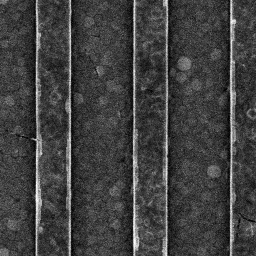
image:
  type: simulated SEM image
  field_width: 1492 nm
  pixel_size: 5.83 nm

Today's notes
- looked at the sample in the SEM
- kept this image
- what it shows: one or a few lines or trenches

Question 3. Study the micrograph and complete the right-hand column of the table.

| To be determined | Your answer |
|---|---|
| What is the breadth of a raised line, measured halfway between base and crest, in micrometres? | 0.196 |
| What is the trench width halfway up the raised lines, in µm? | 0.372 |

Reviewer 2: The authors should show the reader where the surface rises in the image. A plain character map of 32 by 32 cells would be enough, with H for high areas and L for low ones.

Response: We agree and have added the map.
LLLLLHHHHLLLLLLLLHHHHLLLLLLLLHHH
LLLLLHHHHLLLLLLLLHHHHLLLLLLLLHHH
LLLLLHHHHLLLLLLLLHHHHLLLLLLLLHHH
LLLLLHHHHLLLLLLLLHHHHLLLLLLLLHHH
LLLLLHHHHLLLLLLLLHHHHLLLLLLLLHHH
LLLLLHHHHLLLLLLLLHHHHLLLLLLLLHHH
LLLLLHHHHLLLLLLLLHHHHLLLLLLLLHHH
LLLLLHHHHLLLLLLLLHHHHLLLLLLLLHHH
LLLLLHHHHLLLLLLLLHHHHLLLLLLLLHHH
LLLLLHHHHLLLLLLLLHHHHLLLLLLLLHHH
LLLLLHHHHLLLLLLLLHHHHLLLLLLLLHHH
LLLLLHHHHLLLLLLLLHHHHLLLLLLLLHHH
LLLLLHHHHLLLLLLLLHHHHLLLLLLLLHHH
LLLLLHHHHLLLLLLLLHHHHLLLLLLLLHHH
LLLLLHHHHLLLLLLLLHHHHLLLLLLLLHHH
LLLLLHHHHLLLLLLLLHHHHLLLLLLLLHHH
LLLLLHHHHLLLLLLLLHHHHLLLLLLLLHHH
LLLLLHHHHLLLLLLLLHHHHLLLLLLLLHHH
LLLLLHHHHLLLLLLLLHHHHLLLLLLLLHHH
LLLLLHHHHLLLLLLLLHHHHLLLLLLLLHHH
LLLLLHHHHLLLLLLLLHHHHLLLLLLLLHHH
LLLLLHHHHLLLLLLLLHHHHLLLLLLLLHHH
LLLLLHHHHLLLLLLLLHHHHLLLLLLLLHHH
LLLLLHHHHLLLLLLLLHHHHLLLLLLLLHHH
LLLLLHHHHLLLLLLLLHHHHLLLLLLLLHHH
LLLLLHHHHLLLLLLLLHHHHLLLLLLLLHHH
LLLLLHHHHLLLLLLLLHHHHLLLLLLLLHHH
LLLLLHHHHLLLLLLLLHHHHLLLLLLLLHHH
LLLLLHHHHLLLLLLLLHHHHLLLLLLLLHHH
LLLLLHHHHLLLLLLLLHHHHLLLLLLLLHHH
LLLLLHHHHLLLLLLLLHHHHLLLLLLLLHHH
LLLLLHHHHLLLLLLLLHHHHLLLLLLLLHHH